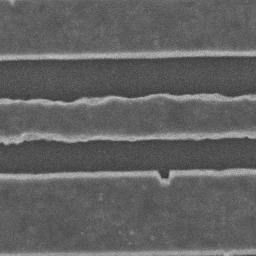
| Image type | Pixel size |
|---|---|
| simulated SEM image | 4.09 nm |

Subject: one or a few lines or trenches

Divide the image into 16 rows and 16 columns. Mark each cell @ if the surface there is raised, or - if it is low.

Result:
@@@@@@@@@@@@@@@@
@@@@@@@@@@@@@@@@
@@@@@@@@@@@@@@@@
@@@@------------
----------------
----------------
@@@@@@@@@@@@@@@@
@@@@@@@@@@@@@@@@
@@-@@@@@@@@@@---
----------------
----------------
@@@@@@@@@@@@@@@@
@@@@@@@@@@@@@@@@
@@@@@@@@@@@@@@@@
@@@@@@@@@@@@@@@@
@@@@@@@@@@@@@@@@